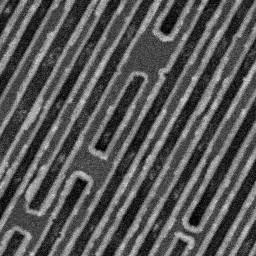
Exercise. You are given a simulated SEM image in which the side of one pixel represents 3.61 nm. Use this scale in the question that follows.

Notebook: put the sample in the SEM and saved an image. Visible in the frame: parallel lines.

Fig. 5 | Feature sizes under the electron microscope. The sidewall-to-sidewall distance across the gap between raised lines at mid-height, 49.4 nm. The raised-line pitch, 106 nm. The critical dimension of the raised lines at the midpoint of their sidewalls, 56.2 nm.